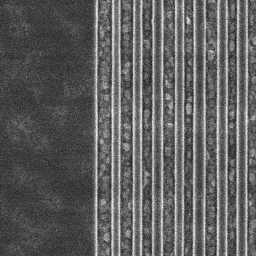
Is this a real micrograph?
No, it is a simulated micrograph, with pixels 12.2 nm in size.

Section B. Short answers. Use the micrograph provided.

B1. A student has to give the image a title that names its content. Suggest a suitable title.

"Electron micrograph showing parallel lines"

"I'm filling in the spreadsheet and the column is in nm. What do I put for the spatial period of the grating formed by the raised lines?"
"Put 256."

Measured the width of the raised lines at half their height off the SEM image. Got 0.111 um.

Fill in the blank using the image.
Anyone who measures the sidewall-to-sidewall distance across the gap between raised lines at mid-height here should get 152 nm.